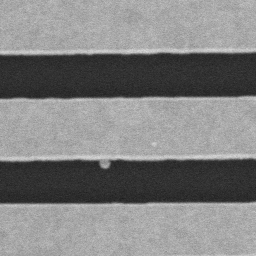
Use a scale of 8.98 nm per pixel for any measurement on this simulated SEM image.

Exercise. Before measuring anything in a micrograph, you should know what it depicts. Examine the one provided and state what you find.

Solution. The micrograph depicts lines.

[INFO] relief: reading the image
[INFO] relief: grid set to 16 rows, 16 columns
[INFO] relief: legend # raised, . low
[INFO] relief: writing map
################
################
################
................
................
................
################
################
################
################
................
................
................
################
################
################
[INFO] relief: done